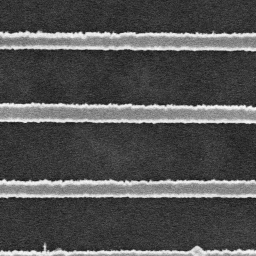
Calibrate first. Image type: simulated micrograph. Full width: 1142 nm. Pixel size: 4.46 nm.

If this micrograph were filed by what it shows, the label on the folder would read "lines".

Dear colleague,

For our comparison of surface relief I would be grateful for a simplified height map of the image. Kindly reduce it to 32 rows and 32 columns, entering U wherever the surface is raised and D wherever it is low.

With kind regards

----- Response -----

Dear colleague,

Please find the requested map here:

DDDDDDDDDDDDDDDDDDDDDDDDDDDDDDDD
DDDDDDDDDDDDDDDDDDDDDDDDDDDDDDDD
DDDDDDDDDDDDDDDDDDDDDDDDDDDDDDDD
DDDDDDDDDDDDDDDDDDDDDDDDDDDDDDDD
UUUUUUUUUUUUUUUUUUUUUUUUUUUUUUUU
UUUUUUUUUUUUUUUUUUUUUUUUUUUUUUUU
DDDDDDDDDDDDDDDDDDDDDDDDDDDDDDDD
DDDDDDDDDDDDDDDDDDDDDDDDDDDDDDDD
DDDDDDDDDDDDDDDDDDDDDDDDDDDDDDDD
DDDDDDDDDDDDDDDDDDDDDDDDDDDDDDDD
DDDDDDDDDDDDDDDDDDDDDDDDDDDDDDDD
DDDDDDDDDDDDDDDDDDDDDDDDDDDDDDDD
DDDDDDDDDDDDDDDDDDDDDDDDDDDDDDDD
UUUUUUUUUUUUUUUUUUUUUUUUUUUUUUUU
UUUUUUUUUUUUUUUUUUUUUUUUUUUUUUUU
DDDDDDDDDDDDDDDDDDDDDDDDDDDDDDDD
DDDDDDDDDDDDDDDDDDDDDDDDDDDDDDDD
DDDDDDDDDDDDDDDDDDDDDDDDDDDDDDDD
DDDDDDDDDDDDDDDDDDDDDDDDDDDDDDDD
DDDDDDDDDDDDDDDDDDDDDDDDDDDDDDDD
DDDDDDDDDDDDDDDDDDDDDDDDDDDDDDDD
DDDDDDDDDDDDDDDDDDDDDDDDDDDDDDDD
DDDDDDDDDDDDDDDDDDDDDDDDDDDDDDDD
UUUUUUUUUUUUUUUUUUUUUUUUUUUUUUUU
UUUUUUUUUUUUUUUUUUUUUUUUUUUUUUUU
DDDDDDDDDDDDDDDDDDDDDDDDDDDDDDDD
DDDDDDDDDDDDDDDDDDDDDDDDDDDDDDDD
DDDDDDDDDDDDDDDDDDDDDDDDDDDDDDDD
DDDDDDDDDDDDDDDDDDDDDDDDDDDDDDDD
DDDDDDDDDDDDDDDDDDDDDDDDDDDDDDDD
DDDDDDDDDDDDDDDDDDDDDDDDDDDDDDDD
DDDDDUDUDUUUUUUUUUUUUUUUUUUUUUUU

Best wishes